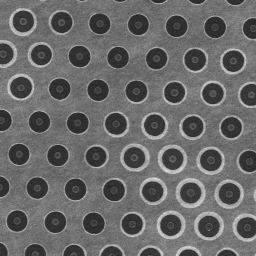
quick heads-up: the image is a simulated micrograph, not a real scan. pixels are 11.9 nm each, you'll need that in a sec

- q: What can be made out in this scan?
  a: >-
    an array of small figures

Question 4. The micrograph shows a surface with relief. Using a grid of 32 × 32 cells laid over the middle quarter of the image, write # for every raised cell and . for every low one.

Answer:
###..#######...######....#####..
###############################.
################################
################################
.######...######....#######..###
..####.....#####.....####.....##
..####.....####......####.....##
.#####.....####......####......#
.######...######....#####.....##
#################..#######...###
################################
################################
##...#######...#######..########
#.....####.....######....#####..
#.....####......####......####..
#.....####......####......###...
#.....#####.....####.....####...
###.########...######....#####..
######################.#########
################################
#######..########.##############
.#####....#####.....#####....###
.####......####......###......##
.####......###.......###......##
.#####.....####......###......##
#######...######....####......##
##########################...###
################################
################################
#....######....#####....######..
......####.....#####.....####...
......####.....####......####...